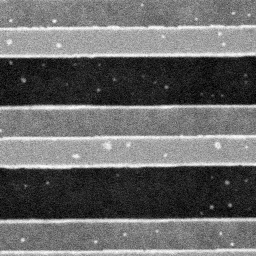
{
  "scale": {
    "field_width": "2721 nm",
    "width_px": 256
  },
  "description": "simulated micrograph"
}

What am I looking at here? lines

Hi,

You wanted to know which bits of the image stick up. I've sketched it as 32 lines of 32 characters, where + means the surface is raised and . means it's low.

++++++++++++++++++++++++++++++++
++++++++++++++++++++++++++++++++
++++++++++++++++++++++++++++++++
++++++++++++++++++++++++++++++++
++++++++++++++++++++++++++++++++
++++++++++++++++++++++++++++++++
++++++++++++++++++++++++++++++++
................................
................................
................................
................................
................................
................................
.....+++++++++++++++++++++++++++
++++++++++++++++++++++++++++++++
++++++++++++++++++++++++++++++++
++++++++++++++++++++++++++++++++
++++++++++++++++++++++++++++++++
++++++++++++++++++++++++++++++++
++++++++++++++++++++++++++++++++
++++++++++++++++++++++++++++++++
................................
................................
................................
................................
................................
................................
................................
++++++++++++++++++++++++++++++++
++++++++++++++++++++++++++++++++
++++++++++++++++++++++++++++++++
++++++++++++++++++++++++++++++++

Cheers